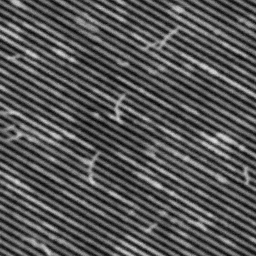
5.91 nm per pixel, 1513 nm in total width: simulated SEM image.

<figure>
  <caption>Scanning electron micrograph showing parallel lines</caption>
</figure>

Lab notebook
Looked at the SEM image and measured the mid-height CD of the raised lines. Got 16.7 nm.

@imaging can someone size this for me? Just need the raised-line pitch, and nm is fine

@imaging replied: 43.9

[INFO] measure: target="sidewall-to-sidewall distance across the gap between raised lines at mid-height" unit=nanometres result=22.5